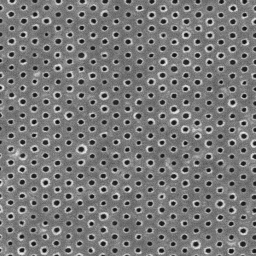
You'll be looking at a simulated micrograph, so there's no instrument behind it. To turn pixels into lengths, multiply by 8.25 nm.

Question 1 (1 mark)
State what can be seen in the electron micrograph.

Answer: a regular array of holes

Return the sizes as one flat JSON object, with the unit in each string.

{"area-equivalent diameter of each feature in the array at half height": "38.4 nm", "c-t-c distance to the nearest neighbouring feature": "108 nm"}